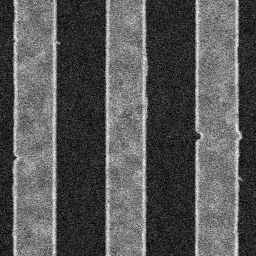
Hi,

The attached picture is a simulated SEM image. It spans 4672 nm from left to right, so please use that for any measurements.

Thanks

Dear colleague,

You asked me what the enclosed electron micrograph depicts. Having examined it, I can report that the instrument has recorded one or a few lines or trenches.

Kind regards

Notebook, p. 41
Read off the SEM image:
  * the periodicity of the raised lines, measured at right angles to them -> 1660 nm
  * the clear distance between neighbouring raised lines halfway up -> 969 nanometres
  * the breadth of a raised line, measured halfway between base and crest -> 700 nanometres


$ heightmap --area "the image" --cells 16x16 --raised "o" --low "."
.oo....oo...ooo.
.oo....oo...ooo.
.oo....oo...ooo.
.oo....oo...ooo.
.oo....oo...ooo.
.oo....oo...ooo.
.oo....oo...ooo.
.oo....oo...ooo.
.oo....oo...ooo.
.oo....oo...ooo.
.oo....oo...ooo.
.oo....oo...ooo.
.oo....oo...ooo.
.oo....oo...ooo.
.oo....oo...ooo.
.oo....oo...ooo.